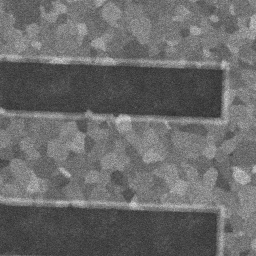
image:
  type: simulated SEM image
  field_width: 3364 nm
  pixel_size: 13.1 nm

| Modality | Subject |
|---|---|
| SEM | one or a few lines or trenches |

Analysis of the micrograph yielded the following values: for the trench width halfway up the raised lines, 772 nm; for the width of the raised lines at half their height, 1110 nm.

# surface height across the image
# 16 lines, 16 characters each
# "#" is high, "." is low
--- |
################
################
################
.###############
..............##
..............##
..............##
#######.#.....##
################
################
################
################
.###############
..............##
..............##
..............##